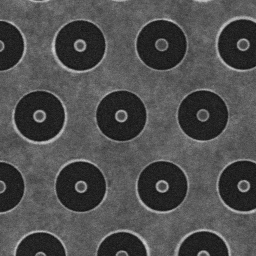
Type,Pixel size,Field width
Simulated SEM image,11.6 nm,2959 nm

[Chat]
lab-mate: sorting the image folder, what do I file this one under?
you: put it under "an array of small figures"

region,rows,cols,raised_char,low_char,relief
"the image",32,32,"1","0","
11111111111111111111111111111111
11111111111111111111111111111111
11111111111111111111011111111000
00111111000011111100000111110000
00011110000001111000000111100000
00011110000001111000100111100010
00011110000001111000000111100000
00011110000001111100000111110000
01111111000011111110001111111000
11111111111111111111111111111111
11111111111111111111111111111111
11110011111111001111111100011111
11000001111110000011111000001111
11000000111100000011110000001111
11001100111100010011110001000111
11000000111100000011110000001111
11000000111110000011111000001111
11100011111111001111111100111111
11111111111111111111111111111111
11111111111111111111111111111111
01111111000011111110001111111000
00111110000001111100000111110000
00011110000001111000000111100000
10011110001001111000100111100010
00011110000001111000000111100000
00111111000011111100000111110000
01111111111111111111011111111101
11111111111111111111111111111111
11111111111111111111111111111111
11100001111110000111111000011111
11000000111100000011110000001111
11000000111100000011110000000111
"